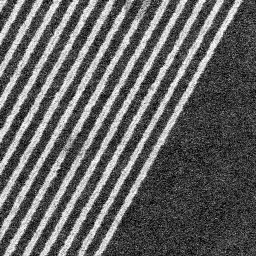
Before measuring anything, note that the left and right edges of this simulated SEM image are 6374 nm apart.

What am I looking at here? parallel lines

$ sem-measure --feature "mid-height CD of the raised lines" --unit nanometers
120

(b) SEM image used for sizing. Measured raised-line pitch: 395 nm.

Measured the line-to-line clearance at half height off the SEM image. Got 275 nanometers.